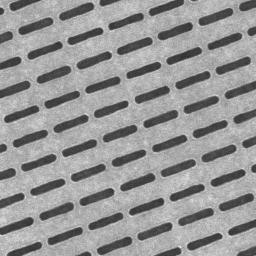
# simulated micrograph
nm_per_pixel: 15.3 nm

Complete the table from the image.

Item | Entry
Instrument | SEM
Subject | a regular array of holes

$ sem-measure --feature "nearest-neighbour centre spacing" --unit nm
395